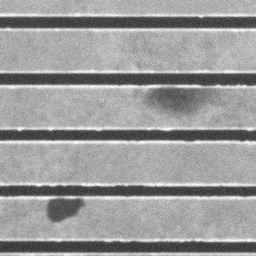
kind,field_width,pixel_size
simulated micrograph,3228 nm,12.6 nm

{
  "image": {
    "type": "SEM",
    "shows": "lines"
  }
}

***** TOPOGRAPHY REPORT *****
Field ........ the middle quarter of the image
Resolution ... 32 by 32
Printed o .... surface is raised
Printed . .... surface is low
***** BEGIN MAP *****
oooooooooooooooooooooooooooooooo
oooooooooooooooooooooooooooooooo
................................
................................
................................
oooooooooooo.ooooooooooooooooooo
oooooooooooooooooooooooooooooooo
oooooooooooooooooooooooooooooooo
oooooooooooooooooooooooooooooooo
oooooooooooooooooooooooooooooooo
oooooooooooooooooooooooooooooooo
oooooooooooooooooooooooooooooooo
oooooooooooooooooooooooooooooooo
oooooooooooooooooooooooooooooooo
oooooooooooooooooooooooooooooooo
oooooooooooooooooooooooooooooooo
................................
................................
................................
oooooooooooooooooo.ooooooooooo..
oooooooooooooooooooooooooooooooo
oooooooooooooooooooooooooooooooo
oooooooooooooooooooooooooooooooo
oooooooooooooooooooooooooooooooo
oooooooooooooooooooooooooooooooo
oooooooooooooooooooooooooooooooo
oooooooooooooooooooooooooooooooo
oooooooooooooooooooooooooooooooo
oooooooooooooooooooooooooooooooo
oooooooooooooooooooooooooooooooo
................................
................................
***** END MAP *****